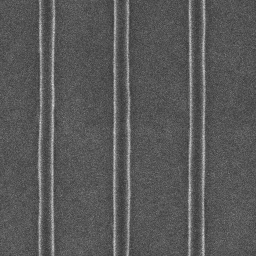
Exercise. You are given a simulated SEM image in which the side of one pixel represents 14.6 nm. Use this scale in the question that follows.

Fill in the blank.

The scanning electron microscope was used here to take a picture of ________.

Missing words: one or a few lines or trenches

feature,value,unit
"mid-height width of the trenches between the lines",892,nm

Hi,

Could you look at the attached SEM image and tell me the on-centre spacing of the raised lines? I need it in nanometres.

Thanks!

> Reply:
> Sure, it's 1100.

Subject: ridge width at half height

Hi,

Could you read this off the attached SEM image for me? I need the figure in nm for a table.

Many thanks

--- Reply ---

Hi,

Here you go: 205